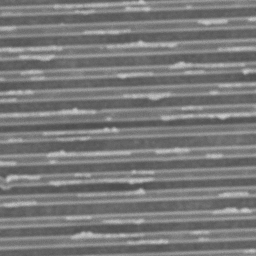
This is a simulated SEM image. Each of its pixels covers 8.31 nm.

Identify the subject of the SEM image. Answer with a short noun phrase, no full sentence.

parallel lines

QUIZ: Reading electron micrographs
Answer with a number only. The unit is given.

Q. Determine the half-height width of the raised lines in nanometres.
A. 84.1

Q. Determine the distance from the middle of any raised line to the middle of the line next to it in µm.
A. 0.175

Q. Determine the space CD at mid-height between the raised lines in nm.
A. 90.3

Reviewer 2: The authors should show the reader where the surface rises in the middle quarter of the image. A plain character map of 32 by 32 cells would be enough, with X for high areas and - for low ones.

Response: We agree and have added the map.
---------------------------XXXXX
-XXXXXXXXXXXXXXXXXXXXXXXXXXXXXXX
XXXXXXXXXXXXXXXXXXXXXXXXXXXXX---
XXX-----------------------------
--------------------------------
----------------------------XXXX
--XXXXXXXXXXXXXXXXXXXXXXXXXXXXXX
XXXXXXXXXXXXXXXXXXXXXXXXXXXXXXXX
XXXXXXXXXX-----------XXX--------
--------------------------------
--------------------------------
--XX----------XXXXXXXXXXXXXXXXXX
XXXXXXXXXXXXXXXXXXXXXXXXXXXXXXXX
XXXXXXXXXXXXXXXXXXXXXXXXXXXX----
X-------------------------------
--------------------------------
---------XXXXXXXXXXXXXXXXXXXXXXX
XXXXXXXXXXXXXXXXXXXXXXXXXXXXXXXX
XXXXXXXXXXXX--------------------
--------------------------------
--------------------------------
---------------------------XXXXX
XXXXXXXXXXXXXXXXXXXXXXXXXXXXXXXX
XXXXXXXXXXXXXXXXXXXXXXXXXXXXX---
XXX-----------------------------
--------------------------------
--------------------------------
---X---XXXXXXXXXXXXXXXXXXXXXXXXX
XXXXXXXXXXXXXXXXXXXXXXXXXXXXXXXX
XXXXXXXXXX---XX-XXXX------------
--------------------------------
------------------XX---------XXX